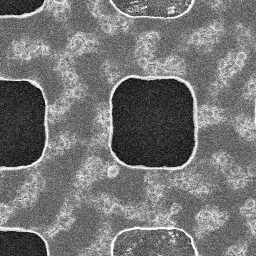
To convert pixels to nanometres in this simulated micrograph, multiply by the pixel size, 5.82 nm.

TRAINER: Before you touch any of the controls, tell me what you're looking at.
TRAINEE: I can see holes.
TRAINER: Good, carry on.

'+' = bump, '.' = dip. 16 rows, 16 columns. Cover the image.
..++++++++++++++
++++++++++++++++
++++++++++++++++
++++++++++++++++
++++++++++++++++
..+++++.....++++
...++++.....++++
...++++.....++++
...++++.....++++
...++++.....++++
++++++++++.+++++
++++++++++++++++
++++++++++++++++
++++++++++++++++
..++++++++++++++
...+++++++++++++